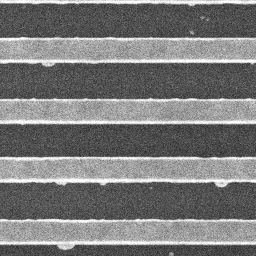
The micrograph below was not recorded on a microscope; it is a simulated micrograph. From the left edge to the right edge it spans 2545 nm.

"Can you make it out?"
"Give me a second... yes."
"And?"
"lines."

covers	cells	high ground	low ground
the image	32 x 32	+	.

................................
................................
................................
................................
................................
++++++++++++++++++++++++++++++++
++++++++++++++++++++++++++++++++
++++++++++++++++++++++++++++++++
................................
................................
................................
................................
++++++++++++++++++++++++++++++++
++++++++++++++++++++++++++++++++
++++++++++++++++++++++++++++++++
................................
................................
................................
................................
................................
++++++++++++++++++++++++++++++++
++++++++++++++++++++++++++++++++
++++++++++++++++++++++++++++++++
................................
................................
................................
................................
+..+++++...++..+.+++..++++.++++.
++++++++++++++++++++++++++++++++
++++++++++++++++++++++++++++++++
..+.+.+++.+++....++....++.++++++
................................